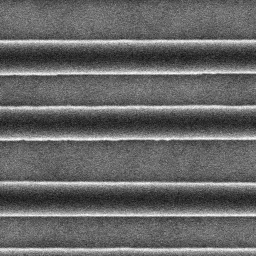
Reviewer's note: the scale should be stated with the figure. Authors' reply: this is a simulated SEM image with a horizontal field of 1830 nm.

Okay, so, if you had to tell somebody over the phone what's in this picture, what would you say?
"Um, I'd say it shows lines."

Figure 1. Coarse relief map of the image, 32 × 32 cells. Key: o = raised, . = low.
................................
................................
................................
................................
................................
oooooooooooooooooooooooooooooooo
oooooooooooooooooooooooooooooooo
oooooooooooooooooooooooooooooooo
oooooooooooooooooooooooooooooooo
................................
................................
................................
................................
oooooooooooooooooooooooooooooooo
oooooooooooooooooooooooooooooooo
oooooooooooooooooooooooooooooooo
oooooooooooooooooooooooooooooooo
................................
................................
................................
................................
................................
................................
oooooooooooooooooooooooooooooooo
oooooooooooooooooooooooooooooooo
oooooooooooooooooooooooooooooooo
oooooooooooooooooooooooooooooooo
................................
................................
................................
................................
oooooooooooooooooooooooooooooooo